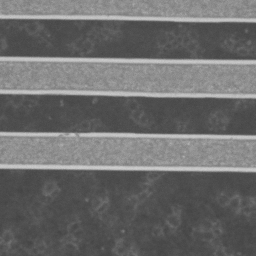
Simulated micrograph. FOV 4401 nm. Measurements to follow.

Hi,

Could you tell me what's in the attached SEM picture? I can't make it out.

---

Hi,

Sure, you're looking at one or a few lines or trenches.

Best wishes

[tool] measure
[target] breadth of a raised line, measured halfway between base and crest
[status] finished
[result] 582 nanometres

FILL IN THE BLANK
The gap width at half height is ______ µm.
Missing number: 0.716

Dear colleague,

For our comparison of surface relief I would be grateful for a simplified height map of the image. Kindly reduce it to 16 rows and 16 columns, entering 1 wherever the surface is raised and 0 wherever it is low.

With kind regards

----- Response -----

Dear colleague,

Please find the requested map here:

1111111111111111
0000000000000000
0000000000000000
0000000000000000
1111111111111111
1111111111111111
0000000000000000
0000000000000000
1111111111110000
1111111111111111
0000000111111111
0000000000000000
0000000000000000
0000000000000000
0000000000000000
0000000000000000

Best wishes